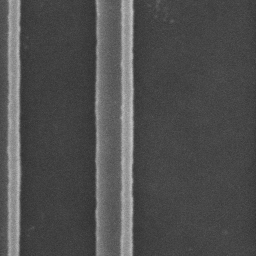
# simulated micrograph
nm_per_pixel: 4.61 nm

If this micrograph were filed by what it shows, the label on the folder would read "lines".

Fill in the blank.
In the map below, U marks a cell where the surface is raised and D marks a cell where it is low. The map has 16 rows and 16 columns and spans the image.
UDDDDDUUDDDDDDDD
UDDDDDUUDDDDDDDD
UDDDDDUUDDDDDDDD
UDDDDDUUDDDDDDDD
UDDDDDUUDDDDDDDD
UDDDDDUUDDDDDDDD
UDDDDDUUDDDDDDDD
UDDDDDUUDDDDDDDD
UDDDDDUUDDDDDDDD
UDDDDDUUDDDDDDDD
UDDDDDUUDDDDDDDD
UDDDDDUUDDDDDDDD
UDDDDDUUDDDDDDDD
UDDDDDUUDDDDDDDD
UDDDDDUUDDDDDDDD
UDDDDDUUDDDDDDDD